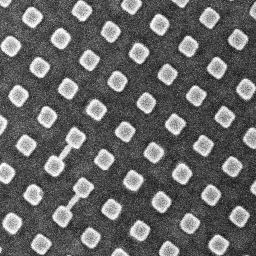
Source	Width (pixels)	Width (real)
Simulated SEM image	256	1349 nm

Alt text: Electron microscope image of a regular array of raised bodies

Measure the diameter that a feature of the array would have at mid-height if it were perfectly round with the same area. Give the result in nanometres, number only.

93.3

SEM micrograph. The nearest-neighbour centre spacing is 0.186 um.